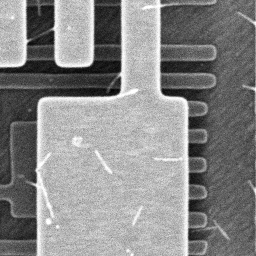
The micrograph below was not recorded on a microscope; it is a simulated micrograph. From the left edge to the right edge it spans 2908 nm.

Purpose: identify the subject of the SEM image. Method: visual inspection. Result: wiring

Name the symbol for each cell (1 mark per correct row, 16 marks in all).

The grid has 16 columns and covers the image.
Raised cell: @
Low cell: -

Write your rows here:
@@-@@@--@@------
@@-@@@--@@------
@@-@@@--@@------
@@-@@@--@@------
--------@@------
--------@@------
--@@@@@@@@@@----
--@@@@@@@@@@----
--@@@@@@@@@@----
--@@@@@@@@@@----
--@@@@@@@@@@----
--@@@@@@@@@@----
--@@@@@@@@@@----
--@@@@@@@@@@----
--@@@@@@@@@@----
--@@@@@@@@@@----